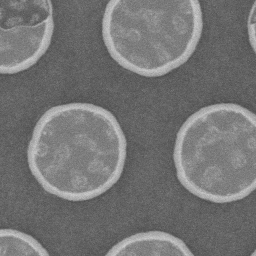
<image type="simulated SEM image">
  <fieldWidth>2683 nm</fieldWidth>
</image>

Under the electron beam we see raised bodies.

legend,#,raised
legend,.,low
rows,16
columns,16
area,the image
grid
.......#####....
..#....#####....
###....#####....
##.....#####....
.........#......
................
................
...####.....####
..######...#####
..######...#####
..#####....#####
...####.....####
................
................
................
##.....####.....